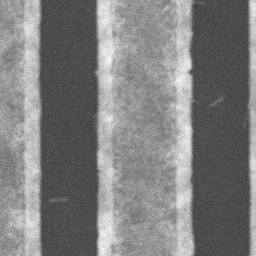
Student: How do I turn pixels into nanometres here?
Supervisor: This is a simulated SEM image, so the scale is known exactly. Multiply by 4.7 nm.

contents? one or a few lines or trenches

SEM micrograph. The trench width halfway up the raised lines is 0.345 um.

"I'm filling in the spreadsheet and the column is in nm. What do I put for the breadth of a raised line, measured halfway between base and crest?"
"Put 366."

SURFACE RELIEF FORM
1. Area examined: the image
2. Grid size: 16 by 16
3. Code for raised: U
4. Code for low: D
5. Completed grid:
UUDDDDDUUUUDDDDD
UUDDDDDUUUUDDDDD
UUDDDDDUUUUDDDDD
UUDDDDDUUUUDDDDD
UUDDDDDUUUUDDDDD
UUDDDDDUUUUDDDDD
UUDDDDDUUUUDDDDD
UUDDDDDUUUUDDDDD
UUDDDDDUUUUDDDDD
UUDDDDDUUUUDDDDD
UUDDDDDUUUUDDDDD
UUDDDDDUUUUDDDDD
UUDDDDDUUUUDDDDD
UUDDDDDUUUUDDDDD
UUDDDDDUUUUUDDDD
UUDDDDDUUUUUDDDD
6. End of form